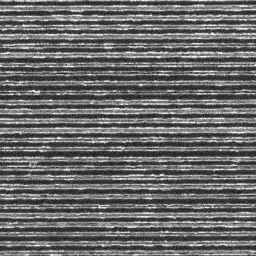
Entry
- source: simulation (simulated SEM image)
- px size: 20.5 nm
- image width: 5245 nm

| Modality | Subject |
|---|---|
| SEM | parallel lines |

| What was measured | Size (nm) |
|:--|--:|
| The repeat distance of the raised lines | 193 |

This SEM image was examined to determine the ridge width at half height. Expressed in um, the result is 0.133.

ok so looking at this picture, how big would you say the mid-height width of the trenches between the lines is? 2.75 pixels